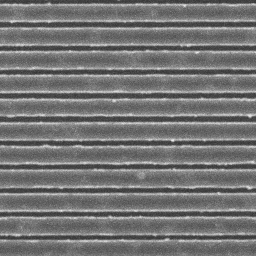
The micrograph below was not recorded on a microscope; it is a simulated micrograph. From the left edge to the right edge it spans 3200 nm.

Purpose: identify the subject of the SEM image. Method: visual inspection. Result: parallel lines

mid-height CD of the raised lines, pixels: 17.8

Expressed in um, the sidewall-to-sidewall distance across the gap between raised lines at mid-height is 0.0766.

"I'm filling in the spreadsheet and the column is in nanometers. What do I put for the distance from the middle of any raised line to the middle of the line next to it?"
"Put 296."